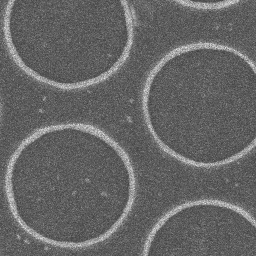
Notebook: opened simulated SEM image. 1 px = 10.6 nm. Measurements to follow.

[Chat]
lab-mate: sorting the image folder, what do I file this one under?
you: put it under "holes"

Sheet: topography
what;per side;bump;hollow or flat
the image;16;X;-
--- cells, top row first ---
X-------XXXXXXXX
--------XXXXXXXX
X-------XXXXXXXX
X-------XXX----X
XX-----XXX------
XXXXXXXXX-------
XXXXXXXXX-------
XXXXXXXXX-------
XX----XXXX------
X------XXXX----X
X-------XXXXXXXX
X-------XXXXXXXX
X-------XXXXXXXX
X-------XXX----X
XX-----XXX------
XXXXXXXXX-------